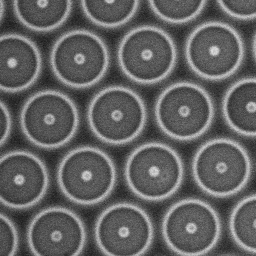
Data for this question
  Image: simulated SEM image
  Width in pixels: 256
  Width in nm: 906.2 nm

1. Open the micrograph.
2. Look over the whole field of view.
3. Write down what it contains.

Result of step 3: an array of small figures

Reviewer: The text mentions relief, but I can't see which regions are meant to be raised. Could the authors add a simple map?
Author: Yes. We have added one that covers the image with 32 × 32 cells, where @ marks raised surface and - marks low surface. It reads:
@@-------@@------@@------@@@----
@@------@@@-----@@@@-----@@@@---
@@@-----@@@@---@@@@@@@-@@@@@@@@@
@@@@@-@@@@@@@@@@@@@@@@@@@---@@@@
@@@@@@@@@--@@@@@-----@@@-----@@@
----@@@------@@------@@@------@@
----@@@------@@---@---@@------@@
-----@@------@@-------@@------@@
-----@@------@@@-----@@@-----@@@
----@@@@----@@@@@---@@@@@@--@@@@
---@@@@@@--@@@@@@@@@@@@@@@@@@@--
@@@@@@@@@@@@@---@@@@@----@@@@---
@@@@----@@@@-----@@@------@@----
@@@------@@@------@@------@@---@
-@@------@@---@---@@------@@----
-@@------@@@------@@------@@@---
-@@------@@@-----@@@@----@@@@@--
@@@@----@@@@@@--@@@@@@@@@@@@@@@@
@@@@@@@@@@@@@@@@@@---@@@@@----@@
@---@@@@@----@@@@-----@@@------@
-----@@@------@@------@@-------@
-----@@@------@@------@@@------@
--@---@@------@@------@@@-----@@
-----@@@------@@@-----@@@@----@@
-----@@@@----@@@@@--@@@@@@@@@@@@
@--@@@@@@@@@@@@@@@@@@@@--@@@@@--
@@@@@@--@@@@@@----@@@-----@@@---
-@@@@-----@@@-----@@@------@@---
-@@@------@@-------@@------@@---
--@@------@@-------@@------@@@--
--@@------@@@-----@@@-----@@@@--
-@@@@-----@@@----@@@@@@--@@@@@@@